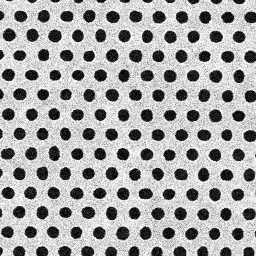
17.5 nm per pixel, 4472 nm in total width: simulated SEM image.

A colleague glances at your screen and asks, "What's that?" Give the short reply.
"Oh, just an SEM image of a regular array of holes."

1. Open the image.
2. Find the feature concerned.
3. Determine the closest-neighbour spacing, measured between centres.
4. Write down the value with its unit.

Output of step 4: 391 nanometers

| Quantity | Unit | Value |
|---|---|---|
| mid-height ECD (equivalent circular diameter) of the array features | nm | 222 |